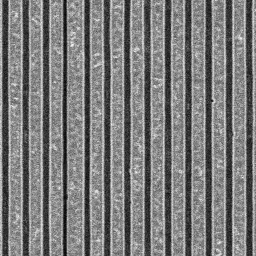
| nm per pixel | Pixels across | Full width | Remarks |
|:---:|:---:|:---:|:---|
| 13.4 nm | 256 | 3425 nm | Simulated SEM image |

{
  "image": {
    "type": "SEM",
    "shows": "parallel lines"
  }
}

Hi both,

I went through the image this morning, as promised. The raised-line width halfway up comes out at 177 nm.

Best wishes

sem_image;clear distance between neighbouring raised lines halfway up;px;7.5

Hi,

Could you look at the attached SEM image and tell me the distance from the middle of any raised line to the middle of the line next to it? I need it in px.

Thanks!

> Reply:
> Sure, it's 20.3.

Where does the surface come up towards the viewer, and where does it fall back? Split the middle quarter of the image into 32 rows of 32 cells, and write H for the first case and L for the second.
LHHHHLLHHHLLHHHLLHHHLLHHHLLHHHLL
LHHHHLLHHHLLHHHLLHHHLLHHHLLHHHLL
LHHHHLLHHHLLHHHLLHHHLLHHHLLHHHLL
LHHHHLLHHHLLHHHLLHHHLLHHHLLHHHLL
LHHHHLLHHHLLHHHLLHHHLLHHHLLHHHLL
LHHHHLLHHHLLHHHLLHHHLLHHHLLHHHLL
LHHHHLLHHHLLHHHLLHHHLLHHHLLHHHLL
LHHHHLLHHHLLHHHLLHHHLLHHHLLHHHLL
LHHHHLLHHHLLHHHLLHHHLLHHHLLHHHLL
LHHHHLLHHHLLHHHLLHHHLLHHHLLHHHLL
LHHHHLLHHHLLHHHLLHHHLLHHHLLHHHLL
LHHHHLLHHHLLHHHLLHHHLLHHHLLHHHLL
LHHHHLLHHHLLHHHLLHHHLLHHHLLHHHLL
LHHHHLLHHHLLHHHLLHHHLLHHHLLHHHLL
LHHHHLLHHHLLHHHLLHHHLLHHHLLHHHLL
LHHHHLLHHHLLHHHLLHHHLLHHHLLHHHLL
LHHHHLLHHHLLHHHLLHHHLLHHHLLHHHLL
LHHHHLLHHHLLHHHLLHHHLLHHHLLHHHLL
LHHHHLLHHHLLHHHLLHHHLLHHHLLHHHLL
LHHHHLLHHHLLHHHLLHHHLLHHHLLHHHLL
LHHHHLLHHHLLHHHLLHHHLLHHHLLHHHLL
LHHHHLLHHHLLHHHLLHHHLLHHHLLHHHLL
LHHHHLLHHHLLHHHLLHHHLLHHHLLHHHLL
LHHHHLLHHHLLHHHLLHHHLLHHHLLHHHLL
LHHHHLLHHHLLHHHLLHHHLLHHHLLHHHLL
LHHHHLLHHHLLHHHLLHHHLLHHHLLHHHLL
LHHHHLLHHHLLHHHLLHHHLLHHHLLHHHLL
LHHHHLLHHHLLHHHLLHHHLLHHHLLHHHLL
LHHHHLLHHHLLHHHLLHHHLLHHHLLHHHLL
LHHHHLLHHHLLHHHLLHHHLLHHHLLHHHLL
LHHHHLLHHHLLHHHLLHHHLLHHHLLHHHLL
LHHHHLLHHHLLHHHLLHHHLLHHHLLHHHLL